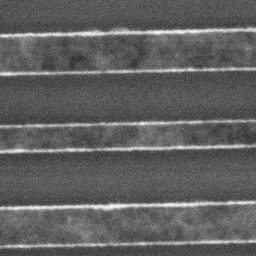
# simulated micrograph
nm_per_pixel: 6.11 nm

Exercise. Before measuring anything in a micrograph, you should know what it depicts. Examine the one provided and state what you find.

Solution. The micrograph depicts lines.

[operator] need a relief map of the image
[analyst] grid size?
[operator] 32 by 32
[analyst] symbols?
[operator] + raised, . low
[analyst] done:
................................
................................
................................
................................
++++++++++++++++++++++++++++++++
++++++++++++++++++++++++++++++++
++++++++++++++++++++++++++++++++
++++++++++++++++++++++++++++++++
++++++++++++++++++++++++++++++++
................................
................................
................................
................................
................................
................................
............++++++++++++++++++++
++++++++++++++++++++++++++++++++
++++++++++++++++++++++++++++++++
+++++++++++++++++++++...........
................................
................................
................................
................................
................................
................................
...................+++++++++++++
++++++++++++++++++++++++++++++++
++++++++++++++++++++++++++++++++
++++++++++++++++++++++++++++++++
++++++++++++++++++++++++++++++++
++++++++++++++++++..............
................................